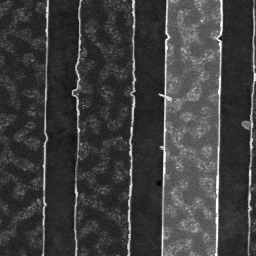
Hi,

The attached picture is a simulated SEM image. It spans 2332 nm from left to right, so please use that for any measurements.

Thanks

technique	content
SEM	one or a few lines or trenches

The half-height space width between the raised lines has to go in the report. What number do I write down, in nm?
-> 287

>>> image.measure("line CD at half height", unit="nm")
504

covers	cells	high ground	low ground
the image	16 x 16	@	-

@@@--@@@--@@@@--
@@@--@@@--@@@@--
@@@--@@@--@@@@--
@@@--@@@--@@@@--
@@@--@@@--@@@@--
@@@--@@@--@@@@--
@@@--@@@--@@@@--
@@@--@@@--@@@@--
@@@--@@@--@@@@--
@@@--@@@--@@@@--
@@@--@@@--@@@@--
@@@--@@@--@@@@--
@@@--@@@--@@@@--
@@@--@@@--@@@@--
@@@--@@@--@@@@--
@@@--@@@--@@@@--